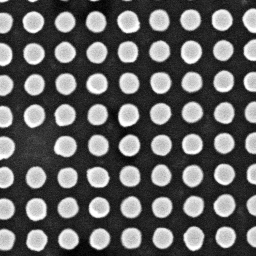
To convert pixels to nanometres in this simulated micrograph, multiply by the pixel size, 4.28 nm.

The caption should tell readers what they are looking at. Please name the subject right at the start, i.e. a regular array of raised bodies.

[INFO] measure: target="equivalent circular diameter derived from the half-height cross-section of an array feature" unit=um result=0.0878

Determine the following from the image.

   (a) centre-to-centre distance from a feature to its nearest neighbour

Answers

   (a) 132 nanometers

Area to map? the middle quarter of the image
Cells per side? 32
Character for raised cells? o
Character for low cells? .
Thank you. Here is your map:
................................
................................
........o......oo......ooo....oo
ooo...oooo....oooo....oooo....oo
ooo...ooooo...ooooo...ooooo...oo
ooo...ooooo...ooooo...ooooo...oo
ooo...oooo....oooo....oooo....oo
o...............................
................................
................................
o......ooo.....ooo.....ooo....oo
oo....ooooo...oooo....oooo....oo
ooo...ooooo...ooooo...ooooo...oo
ooo...ooooo...ooooo...oooo....oo
oo....oooo....oooo....oooo......
...............o................
................................
................................
oo.....ooo.....ooo.....ooo....oo
ooo...ooooo...ooooo...ooooo...oo
ooo...ooooo...ooooo...ooooo...oo
ooo...ooooo...ooooo...oooo....oo
oo.....ooo.....ooo.....ooo.....o
................................
................................
.......................oo......o
ooo...oooo....ooooo...oooo....oo
ooo...ooooo...ooooo...ooooo...oo
ooo...ooooo...ooooo...ooooo...oo
ooo...ooooo...ooooo...oooo....oo
oo.....ooo......o..............o
................................